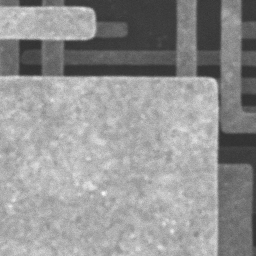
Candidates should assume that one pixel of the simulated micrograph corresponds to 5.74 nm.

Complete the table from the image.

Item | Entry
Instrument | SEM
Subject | wiring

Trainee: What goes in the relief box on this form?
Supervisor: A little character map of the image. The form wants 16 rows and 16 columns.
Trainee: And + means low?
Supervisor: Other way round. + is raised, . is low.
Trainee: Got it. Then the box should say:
+++++...........
++++++..........
................
................
................
++++++++++++++..
++++++++++++++..
++++++++++++++..
++++++++++++++..
++++++++++++++..
++++++++++++++..
++++++++++++++..
++++++++++++++..
++++++++++++++..
++++++++++++++..
++++++++++++++..